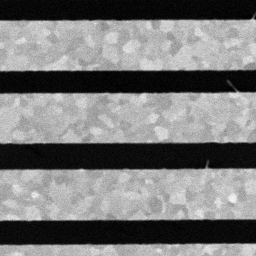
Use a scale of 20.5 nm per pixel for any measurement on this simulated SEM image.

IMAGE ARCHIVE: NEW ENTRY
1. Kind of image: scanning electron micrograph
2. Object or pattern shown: lines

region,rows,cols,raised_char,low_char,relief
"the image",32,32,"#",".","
................................
................................
...............................#
################################
################################
################################
################################
################################
################################
................................
................................
.............................#..
################################
################################
################################
################################
################################
################################
................................
................................
................................
################################
################################
################################
################################
################################
################################
#...............................
................................
................................
................................
################################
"